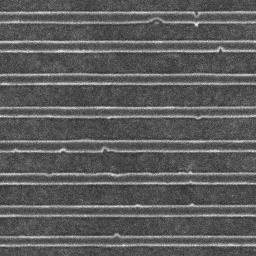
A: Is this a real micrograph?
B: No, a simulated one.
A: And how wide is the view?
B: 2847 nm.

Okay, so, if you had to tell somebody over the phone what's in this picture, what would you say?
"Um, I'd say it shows parallel lines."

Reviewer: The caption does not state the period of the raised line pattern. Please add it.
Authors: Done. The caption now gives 0.355 micrometres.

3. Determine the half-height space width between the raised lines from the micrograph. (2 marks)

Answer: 241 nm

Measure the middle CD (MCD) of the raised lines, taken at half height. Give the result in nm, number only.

111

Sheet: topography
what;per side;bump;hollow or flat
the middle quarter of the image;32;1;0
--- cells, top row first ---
00000000000000000000000000000000
00000000000000000000000000000000
00110000000000000000000000000000
11111111111111111111111111111111
11111111111111111111111111111111
00000000000000000000000000000000
00000000000000000000000000000000
00000000000000000000000000000000
00000000000000000000000000000000
00000000000000000000000000000000
00000000000000000000000000000000
11111111111111111111111111111111
11111111111111111111111111111111
00000000000000000000000000000000
00000000000000000000000000000000
00000000000000000000000000000000
00000000000000000000000000000000
00000000000000000000000000000000
00000000000000000000000000000000
11111111111111111111111111111111
11111111111111111111111111111111
11111111110111111111111111111111
00000000000000000000000000000000
00000000000000000000000000000000
00000000000000000000000000000000
00000000000000000000000000000000
00000000000000000000000000000000
11111000111100011111110111111111
11111111111111111111111111111111
11111111111111111111111111111111
00000000000000000000000000000000
00000000000000000000000000000000